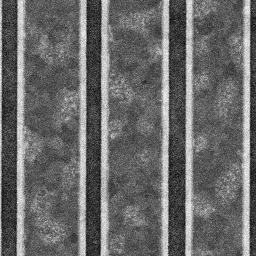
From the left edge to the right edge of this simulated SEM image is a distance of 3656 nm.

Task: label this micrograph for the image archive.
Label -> one or a few lines or trenches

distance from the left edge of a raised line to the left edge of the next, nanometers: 1190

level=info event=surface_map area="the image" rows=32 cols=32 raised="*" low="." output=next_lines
...*******...********...*******.
...*******...********...*******.
...*******...********...*******.
...*******...********...*******.
...*******...********...*******.
...*******...********...*******.
...*******...********...*******.
...*******...********...*******.
...*******...********...*******.
...*******...********...*******.
...*******...********...*******.
...*******...********...*******.
...*******...********...*******.
...*******...********...*******.
...*******...********...*******.
...*******...********...*******.
...*******...********...*******.
...*******...********...*******.
...*******...********...*******.
...*******...********...*******.
...*******...********...*******.
...*******...********...*******.
...*******...********...*******.
...*******...********...*******.
...*******...********...*******.
...*******...********...*******.
...*******...********...*******.
...*******...********...*******.
...*******...********...*******.
...*******...********...*******.
...*******...********...*******.
...*******...********...*******.